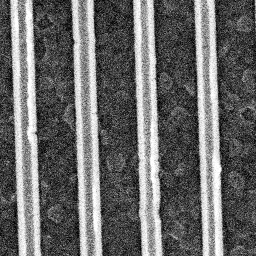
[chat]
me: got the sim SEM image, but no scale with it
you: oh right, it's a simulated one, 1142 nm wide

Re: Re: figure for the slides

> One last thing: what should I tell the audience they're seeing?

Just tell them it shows parallel lines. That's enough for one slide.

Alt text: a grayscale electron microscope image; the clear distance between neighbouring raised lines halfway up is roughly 198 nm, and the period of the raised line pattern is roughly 272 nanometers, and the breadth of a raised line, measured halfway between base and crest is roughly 71.3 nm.